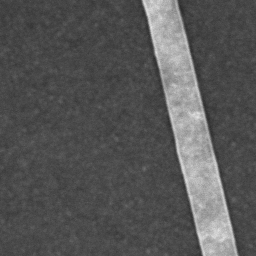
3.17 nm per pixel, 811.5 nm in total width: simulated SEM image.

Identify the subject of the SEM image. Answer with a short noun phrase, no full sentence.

one or a few lines or trenches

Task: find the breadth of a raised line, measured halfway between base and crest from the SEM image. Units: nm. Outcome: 104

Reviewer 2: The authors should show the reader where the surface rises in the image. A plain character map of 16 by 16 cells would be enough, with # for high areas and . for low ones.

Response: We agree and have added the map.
.........##.....
.........##.....
..........##....
..........##....
..........##....
..........##....
..........###...
...........##...
...........##...
...........##...
...........###..
............##..
............##..
............##..
............###.
.............##.